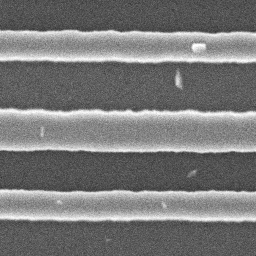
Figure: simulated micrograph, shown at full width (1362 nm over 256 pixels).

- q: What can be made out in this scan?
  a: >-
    lines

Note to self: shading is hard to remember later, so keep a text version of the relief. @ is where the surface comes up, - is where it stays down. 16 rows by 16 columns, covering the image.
----------------
----------------
@@@@@@@@@@@@@@@@
@@@@@@@@@@@@@@@@
----------------
----------------
----------------
@@@@@@@@@@@@@@@@
@@@@@@@@@@@@@@@@
----------------
----------------
----------------
@@@@@@@@@@@@@@@@
@@@@@@@@@@@@@@@@
----------------
----------------